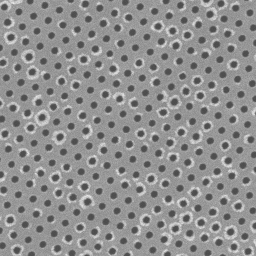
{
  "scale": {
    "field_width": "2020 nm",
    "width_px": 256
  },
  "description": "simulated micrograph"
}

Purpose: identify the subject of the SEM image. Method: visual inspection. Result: a regular array of holes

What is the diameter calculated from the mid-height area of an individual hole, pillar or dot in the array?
54.9 nanometers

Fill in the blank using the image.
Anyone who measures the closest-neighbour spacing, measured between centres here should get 119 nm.